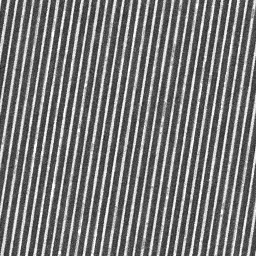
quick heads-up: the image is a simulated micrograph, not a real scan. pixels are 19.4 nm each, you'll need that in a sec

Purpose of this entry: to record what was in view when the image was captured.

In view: parallel lines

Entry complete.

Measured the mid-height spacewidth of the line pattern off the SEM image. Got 113 nm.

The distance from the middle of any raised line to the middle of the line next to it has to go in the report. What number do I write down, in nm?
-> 158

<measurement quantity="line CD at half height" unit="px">1.98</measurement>